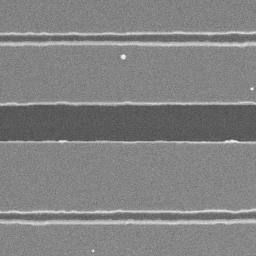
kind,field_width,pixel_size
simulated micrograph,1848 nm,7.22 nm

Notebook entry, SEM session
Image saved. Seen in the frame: lines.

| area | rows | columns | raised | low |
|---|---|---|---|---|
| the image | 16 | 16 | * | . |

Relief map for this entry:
****************
****************
****************
****************
****************
****************
................
................
................
****************
****************
****************
****************
****************
****************
****************